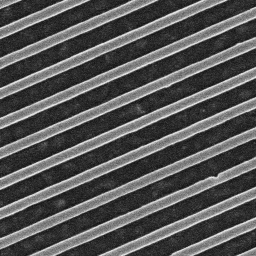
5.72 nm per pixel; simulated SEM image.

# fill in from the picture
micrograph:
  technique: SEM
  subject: parallel lines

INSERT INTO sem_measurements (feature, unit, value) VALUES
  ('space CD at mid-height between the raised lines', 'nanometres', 104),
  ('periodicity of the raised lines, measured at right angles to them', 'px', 27.6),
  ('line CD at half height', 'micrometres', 0.0525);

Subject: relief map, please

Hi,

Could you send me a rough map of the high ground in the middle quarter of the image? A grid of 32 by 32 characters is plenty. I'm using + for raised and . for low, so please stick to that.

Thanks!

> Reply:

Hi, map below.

+++...........++++++...........+
+...........++++++...........+++
..........++++++...........+++++
.......++++++............+++++..
.....++++++...........++++++....
...+++++............++++++......
++++++...........++++++.........
++++...........++++++...........
++...........++++++............+
...........++++++...........++++
.........+++++............+++++.
......++++++............+++++...
....++++++...........++++++.....
..+++++............++++++.......
+++++............+++++..........
+++...........++++++............
+...........++++++...........+++
..........+++++............+++++
........+++++............++++++.
.....++++++...........++++++....
...++++++...........++++++......
.+++++............++++++........
++++............++++++..........
++...........++++++...........++
...........++++++...........++++
.........++++++...........++++++
......++++++...........+++++++..
....++++++...........++++++.....
..+++++............++++++.......
++++++...........++++++.........
+++...........++++++............
+............+++++............++